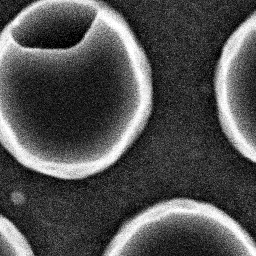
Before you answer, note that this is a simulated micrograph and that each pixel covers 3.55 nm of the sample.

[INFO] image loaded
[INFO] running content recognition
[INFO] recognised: raised bodies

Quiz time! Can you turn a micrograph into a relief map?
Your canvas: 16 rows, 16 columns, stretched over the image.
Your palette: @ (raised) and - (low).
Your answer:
--@@@@----------
-@@@@@@---------
@@@@@@@@-------@
@@@@@@@@@-----@@
@@@@@@@@@-----@@
@@@@@@@@@-----@@
@@@@@@@@@-----@@
@@@@@@@@@-----@@
@@@@@@@@-------@
-@@@@@@--------@
--@@@@----------
----------------
----------------
---------@@@@@--
@-------@@@@@@@-
@------@@@@@@@@@